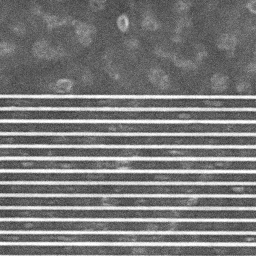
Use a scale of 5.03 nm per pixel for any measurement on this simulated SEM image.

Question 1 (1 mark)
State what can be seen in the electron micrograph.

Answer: parallel lines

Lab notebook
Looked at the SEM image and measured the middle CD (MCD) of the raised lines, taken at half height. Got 2.88 pixels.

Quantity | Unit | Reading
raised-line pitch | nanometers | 61.7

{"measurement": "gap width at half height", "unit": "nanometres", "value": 48.4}